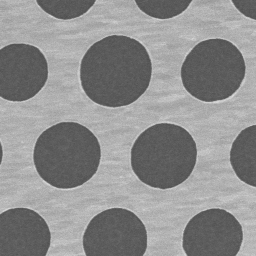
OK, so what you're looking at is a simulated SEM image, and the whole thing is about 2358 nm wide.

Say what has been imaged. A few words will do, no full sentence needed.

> holes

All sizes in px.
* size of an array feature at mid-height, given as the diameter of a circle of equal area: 66.6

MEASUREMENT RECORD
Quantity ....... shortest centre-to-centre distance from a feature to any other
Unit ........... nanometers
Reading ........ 891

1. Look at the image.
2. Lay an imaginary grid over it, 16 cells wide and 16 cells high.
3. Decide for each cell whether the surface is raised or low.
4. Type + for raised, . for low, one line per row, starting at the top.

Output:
+++...+++...+++.
++++++++++++++++
++++++..+++++.++
...++....+++...+
...++....++....+
...++....+++...+
++++++..++++++++
++++++++++++++++
+++...+++...+++.
++....++....++..
++....++....+++.
+++..++++..++++.
++++++++++++++++
...+++...+++...+
...++....++....+
...++....++....+